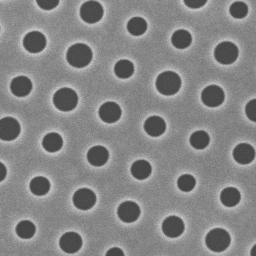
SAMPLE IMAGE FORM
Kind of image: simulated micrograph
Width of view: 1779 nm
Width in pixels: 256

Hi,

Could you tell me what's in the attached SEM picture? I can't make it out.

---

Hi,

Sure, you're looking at a regular array of holes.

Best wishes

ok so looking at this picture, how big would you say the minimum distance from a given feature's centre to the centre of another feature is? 313 nm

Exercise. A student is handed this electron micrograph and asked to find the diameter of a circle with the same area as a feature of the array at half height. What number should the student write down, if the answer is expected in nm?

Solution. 152